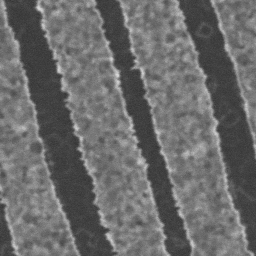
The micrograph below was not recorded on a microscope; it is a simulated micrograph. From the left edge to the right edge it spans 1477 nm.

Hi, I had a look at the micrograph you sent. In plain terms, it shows one or a few lines or trenches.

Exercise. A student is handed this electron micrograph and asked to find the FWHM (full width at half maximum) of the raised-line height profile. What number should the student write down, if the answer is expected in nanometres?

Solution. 316